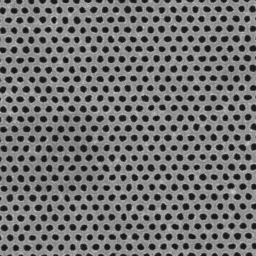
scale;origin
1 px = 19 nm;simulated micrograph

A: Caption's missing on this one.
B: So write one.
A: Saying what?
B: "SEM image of a regular array of holes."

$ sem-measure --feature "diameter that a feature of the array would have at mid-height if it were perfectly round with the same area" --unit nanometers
132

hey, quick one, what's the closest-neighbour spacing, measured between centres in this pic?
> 207 nm